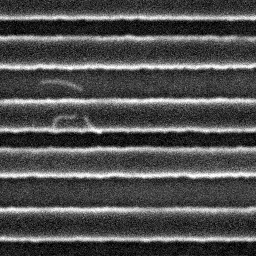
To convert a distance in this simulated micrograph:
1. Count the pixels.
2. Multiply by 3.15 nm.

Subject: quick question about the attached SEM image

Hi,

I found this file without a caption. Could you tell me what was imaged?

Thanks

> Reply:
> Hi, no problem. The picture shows lines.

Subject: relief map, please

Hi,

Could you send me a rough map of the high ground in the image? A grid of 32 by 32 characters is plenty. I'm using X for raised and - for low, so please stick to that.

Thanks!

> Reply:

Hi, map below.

XXXXXXXXXXXXXXXXXXXXXXXXXXXXXXXX
XXXXXXXXXXXXXXXXXXXXXXXXXXXXXXXX
--------------------------------
--------------------------------
--------------------------------
XXXXXXXXXXXXXXXXXXXXXXXXXXXXXXXX
XXXXXXXXXXXXXXXXXXXXXXXXXXXXXXXX
XXXXXXXXXXXXXXXXXXXXXXXXXXXXXXXX
--X-----X-----------------------
--------------------------------
--------------------------------
--------------------------------
------XXXX-X-XXXXXXXXXXXXXXXXXXX
XXXXXXXXXXXXXXXXXXXXXXXXXXXXXXXX
XXXXXXXXXXXXXXXXXXXXXXXXXXXXXXXX
XXXXXXXXXXXXXXXXXXXXXXXXXXXXXXXX
--------------------------------
--------------------------------
--------------------------------
XXXXXXXXXXXXXXXXXXXXXXXXXXXXXXXX
XXXXXXXXXXXXXXXXXXXXXXXXXXXXXXXX
XXXXXXXXXXXXXXXXXXXXXXXXXXXXXXXX
--------------------------------
--------------------------------
--------------------------------
--------------------------------
XXXXXXXXXXXXXXXXXXXXXXXXXXXXXXXX
XXXXXXXXXXXXXXXXXXXXXXXXXXXXXXXX
XXXXXXXXXXXXXXXXXXXXXXXXXXXXXXXX
XXXXXXXXXXXXXXXXXXXXXXXXXXXXXXXX
--------------------------------
--------------------------------